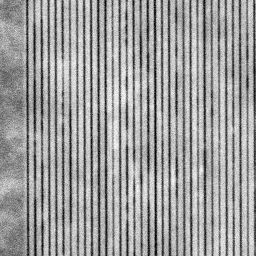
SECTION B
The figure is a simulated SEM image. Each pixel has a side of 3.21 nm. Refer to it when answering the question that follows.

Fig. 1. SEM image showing parallel lines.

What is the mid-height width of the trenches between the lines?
6.4 nanometres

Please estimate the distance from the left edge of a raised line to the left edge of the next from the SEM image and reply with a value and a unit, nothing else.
22.8 nanometers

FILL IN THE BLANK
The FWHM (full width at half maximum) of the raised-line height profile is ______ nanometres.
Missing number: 16